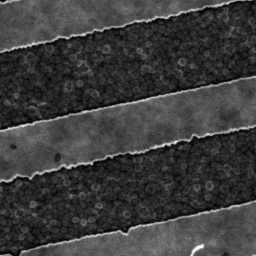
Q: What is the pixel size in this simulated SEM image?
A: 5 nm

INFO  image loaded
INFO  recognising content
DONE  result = one or a few lines or trenches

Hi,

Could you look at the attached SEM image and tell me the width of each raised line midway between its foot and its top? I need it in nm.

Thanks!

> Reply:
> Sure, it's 246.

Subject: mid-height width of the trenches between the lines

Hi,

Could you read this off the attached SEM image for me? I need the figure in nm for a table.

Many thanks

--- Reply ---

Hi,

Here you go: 375